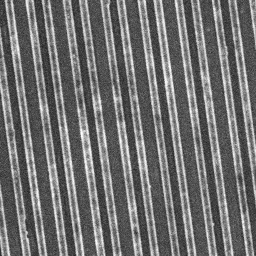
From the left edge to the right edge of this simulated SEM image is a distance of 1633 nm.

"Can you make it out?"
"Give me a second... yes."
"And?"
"parallel lines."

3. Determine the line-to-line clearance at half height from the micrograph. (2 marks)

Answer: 9.89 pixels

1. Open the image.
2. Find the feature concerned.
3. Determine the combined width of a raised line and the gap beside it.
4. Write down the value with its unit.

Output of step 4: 118 nm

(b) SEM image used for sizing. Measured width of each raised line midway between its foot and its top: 44.2 nm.